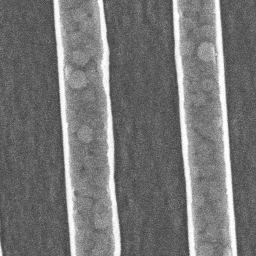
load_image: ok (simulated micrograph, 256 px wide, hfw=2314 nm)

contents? one or a few lines or trenches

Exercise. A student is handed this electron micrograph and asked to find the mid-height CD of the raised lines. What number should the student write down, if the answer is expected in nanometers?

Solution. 402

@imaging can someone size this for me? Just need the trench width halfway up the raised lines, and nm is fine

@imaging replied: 652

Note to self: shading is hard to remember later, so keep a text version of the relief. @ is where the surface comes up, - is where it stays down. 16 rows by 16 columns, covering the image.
---@@@-----@@@--
----@@-----@@@--
----@@@----@@@--
----@@@----@@@--
----@@@----@@@--
----@@@----@@@--
----@@@----@@@--
----@@@----@@@--
----@@@----@@@--
----@@@-----@@--
----@@@-----@@--
----@@@-----@@--
----@@@-----@@--
----@@@-----@@--
----@@@-----@@@-
-----@@-----@@@-